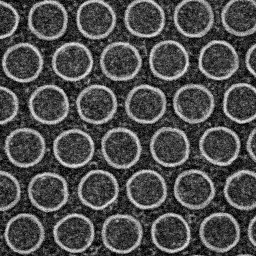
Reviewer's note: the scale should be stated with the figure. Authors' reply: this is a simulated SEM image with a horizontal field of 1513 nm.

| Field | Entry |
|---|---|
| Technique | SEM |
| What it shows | a regular array of raised bodies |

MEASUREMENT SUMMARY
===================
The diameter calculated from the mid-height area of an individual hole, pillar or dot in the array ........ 222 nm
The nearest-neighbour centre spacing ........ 284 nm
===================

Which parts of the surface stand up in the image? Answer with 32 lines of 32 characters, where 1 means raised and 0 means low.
00000110000110000110000111000111
11001111001111001111001111001111
11001111001111001111001111001111
11001111001111001111001111001111
10000110000110000000000000000000
00000000000000010000110000110000
01111001111001111001111001111001
01111001111001111001111001111101
01111001111001111001111001111001
01110000110000111000110000111000
00000000000000000000000000000000
10000111000111000111001111000111
11001111001111001111001111001111
11001111001111001111001111001111
11001111001111001111000111000111
00000000000000000000000000000000
00110000010000110000110000111000
01111001111001111001111001111101
01111001111101111001111001111101
01111001111001111001111000111000
00110000110000110000110000000000
00000000000010000010000010000000
11001111001111001111001111000111
11001111001111101111101111101111
11001111001111001111101111001111
11001111000110000111000111000111
00000000000000000000000000000000
00111000111000111000111000111000
01111001111001111001111001111101
01111001111001111101111101111101
01111001111001111000111000111000
00000000000000000000000000000000